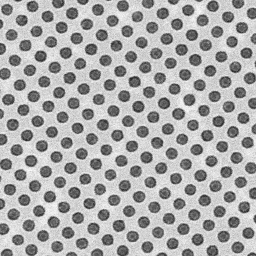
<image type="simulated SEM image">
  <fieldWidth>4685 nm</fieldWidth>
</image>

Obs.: a regular array of ring-shaped grooves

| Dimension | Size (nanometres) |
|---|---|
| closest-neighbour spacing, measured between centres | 322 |